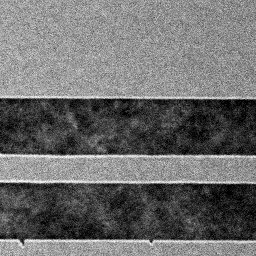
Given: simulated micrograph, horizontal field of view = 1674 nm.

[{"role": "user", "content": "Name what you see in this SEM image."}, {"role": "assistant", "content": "one or a few lines or trenches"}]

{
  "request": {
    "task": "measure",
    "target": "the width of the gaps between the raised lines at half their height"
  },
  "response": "382 nm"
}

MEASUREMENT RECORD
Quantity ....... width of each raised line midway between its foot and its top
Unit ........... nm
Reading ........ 173